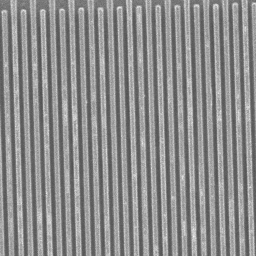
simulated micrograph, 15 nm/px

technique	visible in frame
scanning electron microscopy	parallel lines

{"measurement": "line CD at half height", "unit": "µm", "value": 0.0823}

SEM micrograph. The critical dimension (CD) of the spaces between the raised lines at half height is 69.2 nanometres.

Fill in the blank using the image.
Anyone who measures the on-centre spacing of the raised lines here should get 144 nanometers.